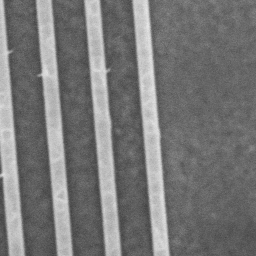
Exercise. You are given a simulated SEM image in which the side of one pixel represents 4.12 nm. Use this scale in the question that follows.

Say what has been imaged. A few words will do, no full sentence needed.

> parallel lines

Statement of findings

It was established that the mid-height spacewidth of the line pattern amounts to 137 nanometers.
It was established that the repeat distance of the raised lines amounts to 48 px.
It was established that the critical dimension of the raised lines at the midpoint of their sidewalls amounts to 0.06 micrometres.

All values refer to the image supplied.